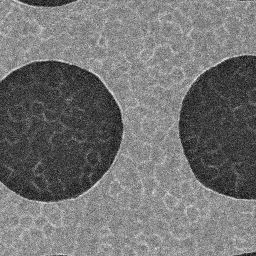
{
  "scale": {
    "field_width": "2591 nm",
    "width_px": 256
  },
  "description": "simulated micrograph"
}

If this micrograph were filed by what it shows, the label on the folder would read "holes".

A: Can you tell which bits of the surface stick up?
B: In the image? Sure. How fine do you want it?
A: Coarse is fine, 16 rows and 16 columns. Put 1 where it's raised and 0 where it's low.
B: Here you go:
1111111111111111
1111111111111111
1111111111111111
1111111111111110
1000001111111000
0000000111110000
0000000111100000
0000000011100000
0000000011100000
0000000111100000
0000000111110000
0000001111111000
1100111111111111
1111111111111111
1111111111111111
1111111111111111